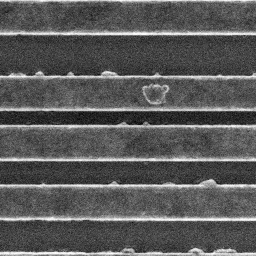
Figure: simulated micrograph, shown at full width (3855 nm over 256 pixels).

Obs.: lines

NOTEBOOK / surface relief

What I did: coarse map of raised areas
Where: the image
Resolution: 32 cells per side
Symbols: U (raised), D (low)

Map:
UUUUUUUUUUUUUUUUUUUUUUUUUUUUUUUU
UUUUUUUUUUUUUUUUUUUUUUUUUUUUUUUU
UUUUUUUUUUUUUUUUUUUUUUUUUUUUUUUU
UUUUUUUUUUUUUUUUUUUUUUUUUUUUUUUU
DDDDDDDDDDDDDDDDDDDDDDDDDDDDDDDD
DDDDDDDDDDDDDDDDDDDDDDDDDDDDDDDD
DDDDDDDDDDDDDDDDDDDDDDDDDDDDDDDD
DDDDDDDDDDDDDDDDDDDDDDDDDDDDDDDD
DDDDDDDDDDDDDDDDDDDDDDDDDDDDDDDD
DDDDUUDDUDDDUUUDDDDDDDDDDDDDDDDD
UUUUUUUUUUUUUUUUUUUUUUUUUUUUUUUU
UUUUUUUUUUUUUUUUUUUUUUUUUUUUUUUU
UUUUUUUUUUUUUUUUUUUUUUUUUUUUUUUU
UUUUUUUUUUUUUUUUUUUUUUUUUUUUUUUU
DDDDDDDDDDDDDDDDDDDDDDDDDDDDDDDD
DDDDDDDDDDDDDDDDDDDDDDDDDDDDDDDD
UUUUUUUUUUUUUUUUUUUUUUUUUUUUUUUU
UUUUUUUUUUUUUUUUUUUUUUUUUUUUUUUU
UUUUUUUUUUUUUUUUUUUUUUUUUUUUUUUU
UUUUUUUUUUUUUUUUUUUUUUUUUUUUUUUU
DDDDDDDDDDDDDDDDDDDDDDDDDDDDDDDD
DDDDDDDDDDDDDDDDDDDDDDDDDDDDDDDD
DDDDDDDDDDDDDDDDDDDDDDDDDDDDDDDD
UUUUUUUUUUUUUUUUUUUUUUUUUUUUUUUU
UUUUUUUUUUUUUUUUUUUUUUUUUUUUUUUU
UUUUUUUUUUUUUUUUUUUUUUUUUUUUUUUU
UUUUUUUUUUUUUUUUUUUUUUUUUUUUUUUU
DDDDDDDDDDDDDDDDDDDDDDDDDDDDDDDD
DDDDDDDDDDDDDDDDDDDDDDDDDDDDDDDD
DDDDDDDDDDDDDDDDDDDDDDDDDDDDDDDD
DDDDDDDDDDDDDDDDDDDDDDDDDDDDDDDD
DDDDDDDDDDDDDDDUUDDDDDDDUDDUUDDD